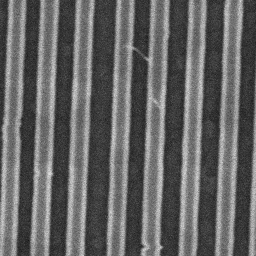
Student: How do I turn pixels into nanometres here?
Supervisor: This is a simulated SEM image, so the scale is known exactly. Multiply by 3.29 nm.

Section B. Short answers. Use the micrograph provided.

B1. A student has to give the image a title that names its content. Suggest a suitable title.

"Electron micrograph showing parallel lines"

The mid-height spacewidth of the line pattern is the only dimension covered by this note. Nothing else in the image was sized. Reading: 71.1 nm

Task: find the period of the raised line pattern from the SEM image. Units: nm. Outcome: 119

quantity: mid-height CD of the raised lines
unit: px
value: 13.9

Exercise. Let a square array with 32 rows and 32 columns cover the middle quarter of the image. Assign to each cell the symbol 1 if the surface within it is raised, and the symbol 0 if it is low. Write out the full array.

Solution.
00011100000001110000001110000001
00011100000001110000011110000001
00011100000001110000011110000001
00011100000001110000011110000001
00011100000001110000001110000001
00011100000001110000001110000001
00011100000001110000001110000001
00011100000001110000011110000001
00011100000001110000011110000001
00011100000001110000011110000001
00011100000001110000011110000001
00011100000001110000011110000001
00011100000001110000011110000001
00111100000001110000011100000001
00111100000001110000011100000001
00111100000001110000011100000001
00111100000011110000011100000001
00111100000011110000011110000001
00111100000011110000011100000001
00111000000011110000011100000011
00111000000011110000011100000011
00111100000011110000011100000011
00111100000011100000011100000011
00111100000011100000011100000011
00111000000011100000011100000011
00111000000011100000011100000011
00111000000011100000011100000011
00111000000011100000011100000011
00111000000011100000011100000011
00111000000011100000011100000011
00111000000011100000111100000011
00111000000011100000111100000011